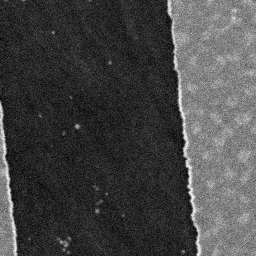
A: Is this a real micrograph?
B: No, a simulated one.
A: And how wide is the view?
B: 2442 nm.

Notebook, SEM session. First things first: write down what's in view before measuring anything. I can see one or a few lines or trenches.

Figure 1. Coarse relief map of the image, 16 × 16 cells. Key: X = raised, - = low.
-----------XXXXX
-----------XXXXX
-----------XXXXX
-----------XXXXX
-----------XXXXX
-----------XXXXX
-----------XXXXX
-----------XXXXX
------------XXXX
------------XXXX
------------XXXX
X-----------XXXX
X-----------XXXX
X-----------XXXX
X-----------XXXX
X-----------XXXX